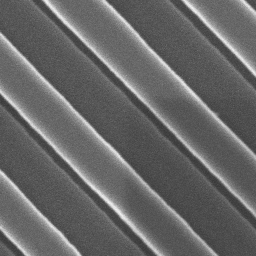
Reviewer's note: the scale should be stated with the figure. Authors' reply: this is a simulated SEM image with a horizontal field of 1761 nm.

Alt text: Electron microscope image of lines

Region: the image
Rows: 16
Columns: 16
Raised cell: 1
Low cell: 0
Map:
0001111000001111
0000111100000111
0000011110000011
1000001111000001
1100000111100000
1110000011110000
0111000001111000
0011100000111100
0001110000011110
0000111000001111
0000011100000111
1000001110000011
1100000111000001
1110000011100000
1111000011110000
0111100001111000